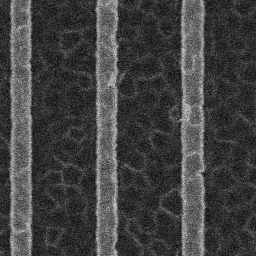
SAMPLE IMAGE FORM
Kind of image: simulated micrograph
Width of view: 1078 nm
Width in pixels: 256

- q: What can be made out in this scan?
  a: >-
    one or a few lines or trenches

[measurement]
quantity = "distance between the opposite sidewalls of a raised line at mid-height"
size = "81.7 nanometres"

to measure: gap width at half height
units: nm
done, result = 280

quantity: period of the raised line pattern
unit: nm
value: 362